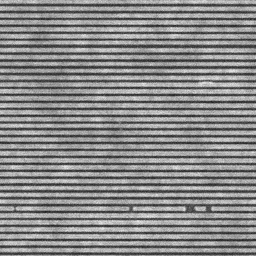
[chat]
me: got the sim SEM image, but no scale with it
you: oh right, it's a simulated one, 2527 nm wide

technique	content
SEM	parallel lines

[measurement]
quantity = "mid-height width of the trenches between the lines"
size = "25.9 nm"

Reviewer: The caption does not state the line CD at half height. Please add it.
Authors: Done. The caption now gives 43.2 nanometers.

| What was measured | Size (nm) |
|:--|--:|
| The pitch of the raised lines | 68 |